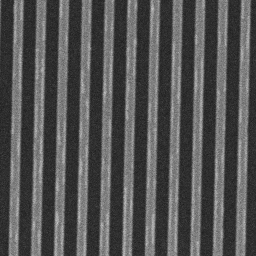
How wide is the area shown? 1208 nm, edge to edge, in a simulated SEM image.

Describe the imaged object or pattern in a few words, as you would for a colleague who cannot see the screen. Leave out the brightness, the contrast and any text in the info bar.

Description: parallel lines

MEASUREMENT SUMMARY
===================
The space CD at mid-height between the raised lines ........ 65.5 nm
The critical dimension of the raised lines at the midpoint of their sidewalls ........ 44.8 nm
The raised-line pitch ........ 22.7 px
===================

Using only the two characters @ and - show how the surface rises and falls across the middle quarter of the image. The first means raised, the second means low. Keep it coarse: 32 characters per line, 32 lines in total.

@---@@----@@----@@---@@@---@@---
@---@@----@@----@@---@@----@@---
@---@@----@@----@@---@@----@@---
@---@@----@@----@@---@@----@@---
@---@@----@@----@@---@@----@@---
@---@@----@@----@@---@@----@@---
----@@----@@----@@---@@----@@---
----@@----@@----@@---@@----@@---
----@@----@@----@@---@@----@@---
----@@----@@----@@---@@----@@---
----@@----@@----@----@@----@@---
----@@----@@----@----@@----@@---
----@@----@@----@----@@----@@---
----@@----@@---@@----@@----@@---
----@@----@@---@@----@@----@@---
----@@----@@---@@----@@----@@---
----@@----@@---@@----@@----@@---
----@@----@@---@@@---@@----@@---
----@@----@@---@@@---@@----@@---
----@@----@@---@@----@@----@@---
----@@----@@---@@----@@----@@---
----@@----@@---@@----@@----@@---
----@@----@@---@@----@@----@@---
----@@----@@---@@----@@----@@---
----@@----@@---@@----@@---@@@---
----@@----@@---@@----@@---@@@---
----@@----@@---@@----@@---@@@---
----@@----@----@@----@@---@@@---
----@@----@----@@----@@---@@@---
----@@----@----@@----@@---@@@---
----@@----@----@@----@@---@@@---
----@@---@@----@@----@@---@@----